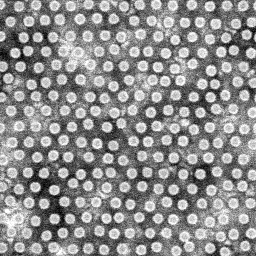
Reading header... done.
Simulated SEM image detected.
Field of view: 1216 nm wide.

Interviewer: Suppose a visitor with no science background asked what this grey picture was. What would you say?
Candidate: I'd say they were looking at a regular array of raised bodies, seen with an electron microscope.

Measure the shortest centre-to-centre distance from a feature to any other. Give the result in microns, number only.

0.0717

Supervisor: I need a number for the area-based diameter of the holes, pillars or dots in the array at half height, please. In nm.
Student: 45.1